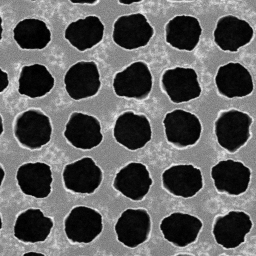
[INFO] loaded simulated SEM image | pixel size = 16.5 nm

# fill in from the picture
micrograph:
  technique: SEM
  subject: a regular array of holes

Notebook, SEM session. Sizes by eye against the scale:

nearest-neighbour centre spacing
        0.78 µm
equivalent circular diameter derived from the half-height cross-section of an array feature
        602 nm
